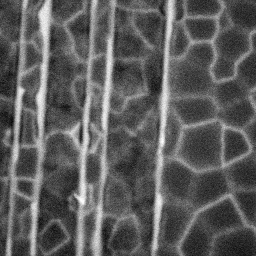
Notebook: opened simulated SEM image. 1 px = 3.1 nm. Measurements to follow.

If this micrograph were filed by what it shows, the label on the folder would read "one or a few lines or trenches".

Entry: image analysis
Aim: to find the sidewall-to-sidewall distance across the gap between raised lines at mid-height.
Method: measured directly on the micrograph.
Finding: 149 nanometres